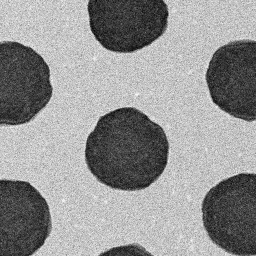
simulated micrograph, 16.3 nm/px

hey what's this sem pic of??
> holes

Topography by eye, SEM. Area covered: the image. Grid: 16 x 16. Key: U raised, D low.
UUUUUUDDDDUUUUUU
UUUUUUDDDDUUUUUU
UUUUUUDDDDUUUUUU
DDUUUUUUUUUUUDDD
DDDUUUUUUUUUUDDD
DDDUUUUUUUUUUDDD
DDDUUUUUUUUUUUDD
DDUUUUDDDUUUUUUD
UUUUUUDDDDUUUUUU
UUUUUDDDDDDUUUUU
UUUUUUDDDDUUUUUU
DDUUUUUDDUUUUUDD
DDDUUUUUUUUUUDDD
DDDUUUUUUUUUUDDD
DDDUUUUUUUUUUDDD
DDUUUUUDDUUUUUDD